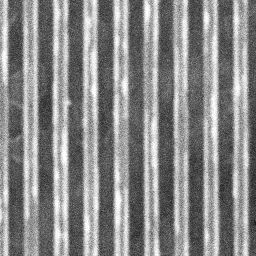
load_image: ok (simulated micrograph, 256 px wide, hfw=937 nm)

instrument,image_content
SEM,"parallel lines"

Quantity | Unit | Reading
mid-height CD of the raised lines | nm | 47.5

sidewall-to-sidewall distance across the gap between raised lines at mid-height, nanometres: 62.2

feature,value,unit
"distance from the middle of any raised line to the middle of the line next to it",110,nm